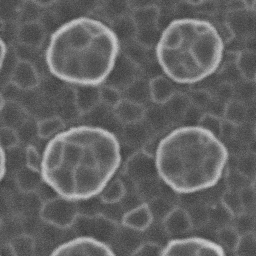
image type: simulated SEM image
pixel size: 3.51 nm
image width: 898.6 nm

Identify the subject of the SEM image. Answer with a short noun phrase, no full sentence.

raised bodies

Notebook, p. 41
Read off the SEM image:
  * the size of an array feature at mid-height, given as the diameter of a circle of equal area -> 231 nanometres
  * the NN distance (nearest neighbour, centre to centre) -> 378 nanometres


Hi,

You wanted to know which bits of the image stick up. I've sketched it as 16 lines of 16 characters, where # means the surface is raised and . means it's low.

................
....##.....##...
...####...####..
...####...####..
...####...###...
................
................
................
....###....##...
...####...####..
...####...####..
...####....##...
................
................
................
....###...####..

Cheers